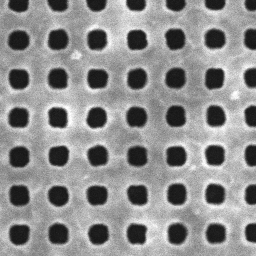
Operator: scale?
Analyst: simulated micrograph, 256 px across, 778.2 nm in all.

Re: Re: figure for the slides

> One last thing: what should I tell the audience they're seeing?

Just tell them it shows a regular array of holes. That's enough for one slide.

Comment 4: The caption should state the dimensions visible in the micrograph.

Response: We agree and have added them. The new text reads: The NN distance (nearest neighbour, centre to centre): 116 nanometers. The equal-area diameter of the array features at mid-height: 66.1 nm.